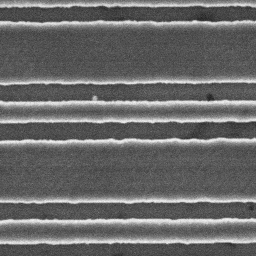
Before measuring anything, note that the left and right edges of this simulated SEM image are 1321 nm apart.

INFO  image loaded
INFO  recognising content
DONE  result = lines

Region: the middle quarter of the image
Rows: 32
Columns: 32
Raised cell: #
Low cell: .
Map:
################################
################################
################################
################################
#######################..#..#..#
................................
................................
................................
................................
............................#...
################################
################################
################################
################################
........##....##.............#..
................................
................................
................................
................................
################################
################################
################################
################################
################################
################################
################################
################################
################################
################################
################################
################################
################################